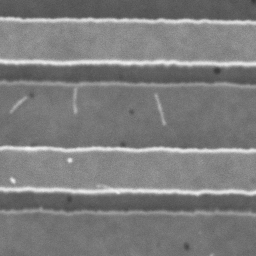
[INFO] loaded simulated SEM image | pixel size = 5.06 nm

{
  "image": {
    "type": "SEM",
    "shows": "lines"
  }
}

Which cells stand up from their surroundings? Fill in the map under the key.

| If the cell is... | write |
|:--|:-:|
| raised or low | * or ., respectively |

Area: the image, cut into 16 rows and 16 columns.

................
****************
****************
****************
................
................
................
................
................
****************
****************
****************
................
................
................
................